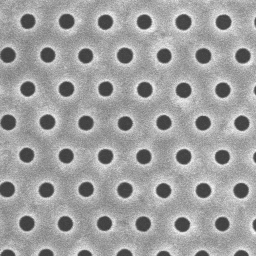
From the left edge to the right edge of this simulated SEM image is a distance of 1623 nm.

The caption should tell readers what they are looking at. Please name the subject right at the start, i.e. a regular array of holes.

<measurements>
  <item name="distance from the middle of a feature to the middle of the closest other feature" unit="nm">243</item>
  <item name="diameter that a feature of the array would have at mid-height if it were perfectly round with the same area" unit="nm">97.8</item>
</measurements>